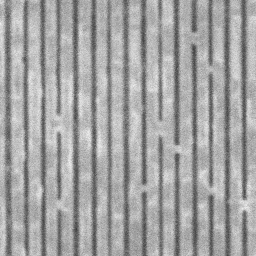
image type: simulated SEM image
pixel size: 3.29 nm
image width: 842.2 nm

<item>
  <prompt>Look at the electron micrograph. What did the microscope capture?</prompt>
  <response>parallel lines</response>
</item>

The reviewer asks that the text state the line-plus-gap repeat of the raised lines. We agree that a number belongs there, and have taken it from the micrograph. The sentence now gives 55.2 nm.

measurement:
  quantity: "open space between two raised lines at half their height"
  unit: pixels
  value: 5.5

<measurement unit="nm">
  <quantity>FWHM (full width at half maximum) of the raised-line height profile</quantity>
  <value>36.5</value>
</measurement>